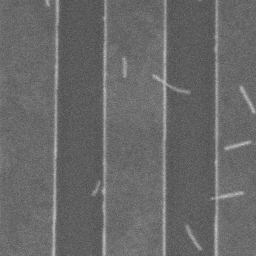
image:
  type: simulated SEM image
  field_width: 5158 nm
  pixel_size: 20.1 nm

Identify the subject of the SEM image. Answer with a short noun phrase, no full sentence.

lines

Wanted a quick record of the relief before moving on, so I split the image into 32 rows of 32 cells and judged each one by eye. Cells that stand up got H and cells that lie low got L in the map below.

HHHHHHHLLLLLLHHHHHHHHLLLLLLHHHHH
HHHHHHHLLLLLLHHHHHHHHLLLLLLHHHHH
HHHHHHHLLLLLLHHHHHHHHLLLLLLHHHHH
HHHHHHHLLLLLLHHHHHHHHLLLLLLHHHHH
HHHHHHHLLLLLLHHHHHHHHLLLLLLHHHHH
HHHHHHHLLLLLLHHHHHHHHLLLLLLHHHHH
HHHHHHHLLLLLLHHHHHHHHLLLLLLHHHHH
HHHHHHHLLLLLLHHHHHHHHLLLLLLHHHHH
HHHHHHHLLLLLLHHHHHHHHLLLLLLHHHHH
HHHHHHHLLLLLLHHHHHHHHLLLLLLHHHHH
HHHHHHHLLLLLLHHHHHHHHLLLLLLHHHHH
HHHHHHHLLLLLLHHHHHHHHLLLLLLHHHHH
HHHHHHHLLLLLLHHHHHHHHLLLLLLHHHHH
HHHHHHHLLLLLLHHHHHHHHLLLLLLHHHHH
HHHHHHHLLLLLLHHHHHHHHLLLLLLHHHHH
HHHHHHHLLLLLLHHHHHHHHLLLLLLHHHHH
HHHHHHHLLLLLLHHHHHHHHLLLLLLHHHHH
HHHHHHHLLLLLLHHHHHHHHLLLLLLHHHHH
HHHHHHHLLLLLLHHHHHHHHLLLLLLHHHHH
HHHHHHHLLLLLLHHHHHHHHLLLLLLHHHHH
HHHHHHHLLLLLLHHHHHHHHLLLLLLHHHHH
HHHHHHHLLLLLLHHHHHHHHLLLLLLHHHHH
HHHHHHHLLLLLLHHHHHHHHLLLLLLHHHHH
HHHHHHHLLLLLLHHHHHHHHLLLLLLHHHHH
HHHHHHHLLLLLLHHHHHHHHLLLLLLHHHHH
HHHHHHHLLLLLLHHHHHHHHLLLLLLHHHHH
HHHHHHHLLLLLLHHHHHHHHLLLLLLHHHHH
HHHHHHHLLLLLLHHHHHHHHLLLLLLHHHHH
HHHHHHHLLLLLLHHHHHHHHLLLLLLHHHHH
HHHHHHHLLLLLLHHHHHHHHLLLLLLHHHHH
HHHHHHHLLLLLLHHHHHHHHLLLLLLHHHHH
HHHHHHHLLLLLLHHHHHHHHLLLLLLHHHHH